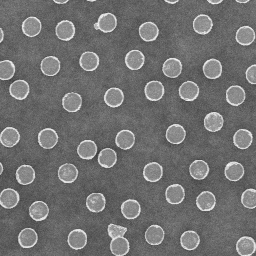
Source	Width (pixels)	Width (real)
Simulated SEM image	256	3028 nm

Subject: a regular array of raised bodies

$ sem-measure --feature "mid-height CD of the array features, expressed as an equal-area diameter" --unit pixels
18.9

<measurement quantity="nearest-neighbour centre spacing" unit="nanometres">401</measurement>